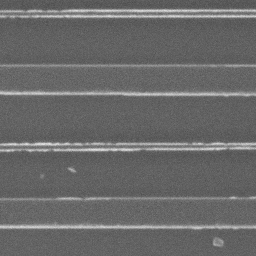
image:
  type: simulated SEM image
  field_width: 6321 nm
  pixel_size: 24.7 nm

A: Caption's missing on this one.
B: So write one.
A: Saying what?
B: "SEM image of lines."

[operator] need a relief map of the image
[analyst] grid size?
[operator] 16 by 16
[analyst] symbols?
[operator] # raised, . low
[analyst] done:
................
................
................
................
################
################
................
................
................
................
................
................
################
################
................
................